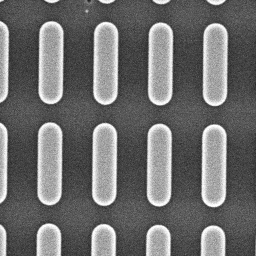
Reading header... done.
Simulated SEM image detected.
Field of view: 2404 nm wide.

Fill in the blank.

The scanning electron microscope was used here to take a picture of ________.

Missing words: groups of lines, slits or small figures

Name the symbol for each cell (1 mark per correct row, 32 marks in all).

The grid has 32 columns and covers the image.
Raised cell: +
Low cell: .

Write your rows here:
................................
................................
................................
+....+++....++.....++.....++....
+....+++....+++....++....+++....
+....+++....+++....++....+++....
+....+++....+++....++....+++....
+....+++....+++....++....+++....
+....+++....+++....++....+++....
+....+++....+++....++....+++....
+....+++....+++....++....+++....
+....+++....+++....++....+++....
.....++.....++.....++.....++....
................................
................................
......+.........................
+....+++....+++....++....+++....
+....+++....+++....++....+++....
+....+++....+++....++....+++....
+....+++....+++....++....+++....
+....+++....+++...+++....+++....
+....+++....+++...+++....+++....
+....+++....++....+++....+++....
+....+++....++....+++....+++....
+....+++....++....+++....+++....
......+.....++.....++.....++....
................................
................................
.....++.....++.....++.....+.....
+....+++...+++....+++....+++....
+....++....+++....+++....+++....
+....++....+++....+++....+++....